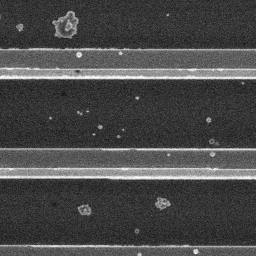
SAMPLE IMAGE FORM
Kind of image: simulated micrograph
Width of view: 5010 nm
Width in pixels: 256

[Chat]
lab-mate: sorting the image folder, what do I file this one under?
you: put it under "lines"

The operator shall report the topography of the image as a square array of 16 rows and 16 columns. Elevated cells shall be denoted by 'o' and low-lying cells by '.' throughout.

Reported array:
................
................
................
oooooooooooooooo
oooooooooooooooo
................
................
................
................
oooooooooooooooo
oooooooooooooooo
................
................
................
................
oooooooooooooooo